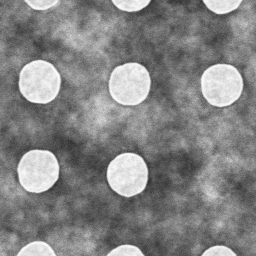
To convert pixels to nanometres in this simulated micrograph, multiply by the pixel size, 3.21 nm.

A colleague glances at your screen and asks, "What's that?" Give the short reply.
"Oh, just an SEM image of raised bodies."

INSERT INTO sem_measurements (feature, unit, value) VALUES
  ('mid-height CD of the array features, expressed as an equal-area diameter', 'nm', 134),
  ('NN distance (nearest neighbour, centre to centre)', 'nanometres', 288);